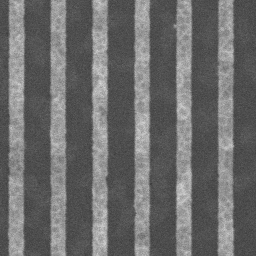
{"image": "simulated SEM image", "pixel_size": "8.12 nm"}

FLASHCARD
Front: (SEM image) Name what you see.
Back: parallel lines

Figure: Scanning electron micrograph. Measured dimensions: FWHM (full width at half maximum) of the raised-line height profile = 112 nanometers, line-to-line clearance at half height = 230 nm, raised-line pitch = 340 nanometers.